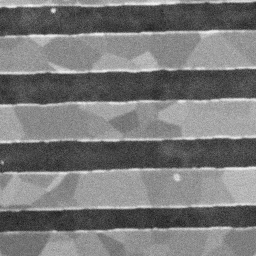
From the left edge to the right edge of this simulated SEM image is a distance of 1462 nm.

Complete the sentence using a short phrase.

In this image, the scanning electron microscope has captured lines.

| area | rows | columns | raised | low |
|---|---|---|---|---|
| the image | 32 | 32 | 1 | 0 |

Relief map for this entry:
11111111111111111110000000000000
00000000000000000000000000000000
00000000000000000000000000000000
00000000000000000000000000000000
00001111111111111111111111111111
11111111111111111111111111111111
11111111111111111111111111111111
11111111111111111111111111111111
11111111111111111111111111111111
00000000000000000000000000000000
00000000000000000000000000000000
00000000000000000000000000000000
00000000000000000000000000011111
11111111111111111111111111111111
11111111111111111111111111111111
11111111111111111111111111111111
11111111111111111111111111111111
11111111001111100000000000000000
00000000000000000000000000000000
00000000000000000000000000000000
00000000000000000000000000000000
00000000011111111111111111111111
11111111111111111111111111111111
11111111111111111111111111111111
11111111111111111111111111111111
11111111111111111111111111111111
00000000000000000000000000000000
00000000000000000000000000000000
00000000000000000000000000111001
11111111111111111111111111111111
11111111111111111111111111111111
11111111111111111111111111111111